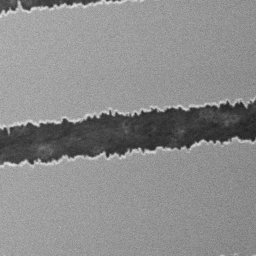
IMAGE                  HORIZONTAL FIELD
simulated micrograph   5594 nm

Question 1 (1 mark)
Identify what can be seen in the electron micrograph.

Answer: one or a few lines or trenches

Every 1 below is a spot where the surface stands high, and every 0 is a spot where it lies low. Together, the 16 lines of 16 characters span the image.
0001111111111111
1111111111111111
1111111111111111
1111111111111111
1111111111111111
1111111111111111
1111111111111100
1111100000000000
0000000000000000
0000000011111111
1111111111111111
1111111111111111
1111111111111111
1111111111111111
1111111111111111
1111111111111111